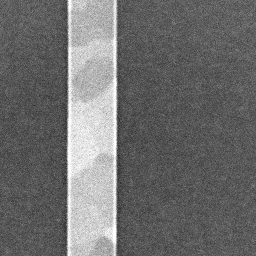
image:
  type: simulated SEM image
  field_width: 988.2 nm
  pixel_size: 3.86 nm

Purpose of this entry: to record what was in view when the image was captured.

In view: one or a few lines or trenches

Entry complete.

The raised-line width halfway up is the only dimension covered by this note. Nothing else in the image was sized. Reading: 46.6 pixels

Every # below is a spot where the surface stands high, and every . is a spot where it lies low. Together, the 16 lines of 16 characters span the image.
....###.........
....###.........
....###.........
....###.........
....###.........
....###.........
....###.........
....###.........
....###.........
....###.........
....###.........
....###.........
....###.........
....###.........
....###.........
....###.........